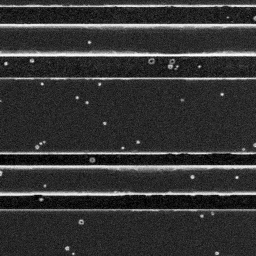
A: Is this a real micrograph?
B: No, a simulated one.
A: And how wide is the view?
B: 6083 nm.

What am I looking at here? lines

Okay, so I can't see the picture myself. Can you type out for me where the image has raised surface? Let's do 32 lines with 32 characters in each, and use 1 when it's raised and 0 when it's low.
11111111111111111111111111111111
00000000000000000000000000000000
00000000000000000000000000000000
11111111111111111111111111111111
11111111111111111111111111111111
11111111111111111111111111111111
11111111111111111111111111111111
00000000000000000000000000000000
00000000000000000000000000000000
00000000000000000000000000000000
11111111111111111111111111111111
11111111111111111111111111111111
11111111111111111111111111111111
11111111111111111111111111111111
11111111111111111111111111111111
11111111111111111111111111111111
11111111111111111111111111111111
11111111111111111111111111111111
11111111111111111111111111111111
00000000000000000000000000000000
00000000000000000000000000000000
11111111111111111111111111111111
11111111111111111111111111111111
11111111111111111111111111111111
00000000000000000000000000000000
00000000000000000000000000000000
11111111111111111111111111111111
11111111111111111111111111111111
11111111111111111111111111111111
11111111111111111111111111111111
11111111111111111111111111111111
11111111111111111111111111111111